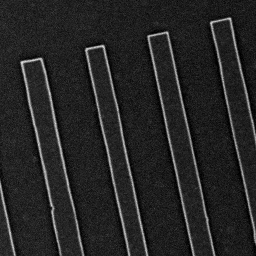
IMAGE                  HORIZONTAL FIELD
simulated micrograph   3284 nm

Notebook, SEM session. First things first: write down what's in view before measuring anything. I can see one or a few lines or trenches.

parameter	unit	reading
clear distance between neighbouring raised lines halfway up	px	44.7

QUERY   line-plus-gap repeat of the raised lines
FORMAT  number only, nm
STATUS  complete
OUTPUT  823